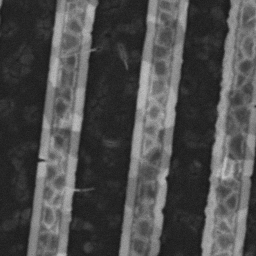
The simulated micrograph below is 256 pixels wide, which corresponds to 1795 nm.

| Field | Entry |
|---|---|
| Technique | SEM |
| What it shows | one or a few lines or trenches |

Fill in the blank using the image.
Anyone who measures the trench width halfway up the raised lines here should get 398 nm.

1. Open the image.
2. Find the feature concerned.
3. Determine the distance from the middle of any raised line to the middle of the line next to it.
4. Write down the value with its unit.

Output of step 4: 623 nanometres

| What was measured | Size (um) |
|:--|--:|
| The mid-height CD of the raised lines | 0.205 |